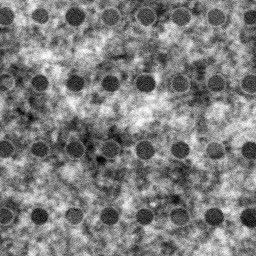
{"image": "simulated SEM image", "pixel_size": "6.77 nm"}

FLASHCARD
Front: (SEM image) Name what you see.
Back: a regular array of raised bodies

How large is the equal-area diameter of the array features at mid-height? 133 nm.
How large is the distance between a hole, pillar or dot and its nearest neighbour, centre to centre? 237 nm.